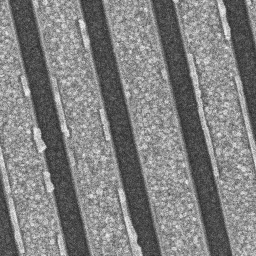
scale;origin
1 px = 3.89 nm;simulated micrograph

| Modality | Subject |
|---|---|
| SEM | one or a few lines or trenches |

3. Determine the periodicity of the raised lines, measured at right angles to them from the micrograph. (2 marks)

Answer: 69.1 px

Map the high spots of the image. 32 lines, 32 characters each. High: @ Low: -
@---@@@@@@---@@@@@@---@@@@@@---@
@---@@@@@@---@@@@@@---@@@@@@---@
@@---@@@@@@--@@@@@@---@@@@@@---@
@@---@@@@@@---@@@@@@---@@@@@@---
@@---@@@@@@---@@@@@@---@@@@@@---
@@---@@@@@@---@@@@@@---@@@@@@---
@@---@@@@@@---@@@@@@---@@@@@@---
@@@---@@@@@@---@@@@@@--@@@@@@---
@@@---@@@@@@---@@@@@@---@@@@@@--
@@@---@@@@@@---@@@@@@---@@@@@@--
@@@---@@@@@@---@@@@@@---@@@@@@--
@@@@---@@@@@@---@@@@@---@@@@@@--
@@@@---@@@@@@---@@@@@@---@@@@@@-
@@@@---@@@@@@---@@@@@@---@@@@@@-
@@@@---@@@@@@---@@@@@@---@@@@@@-
@@@@@---@@@@@@--@@@@@@---@@@@@@-
@@@@@---@@@@@@---@@@@@@---@@@@@@
@@@@@---@@@@@@---@@@@@@---@@@@@@
@@@@@@--@@@@@@---@@@@@@---@@@@@@
@@@@@@--@@@@@@---@@@@@@---@@@@@@
@@@@@@---@@@@@@---@@@@@@--@@@@@@
@@@@@@---@@@@@@---@@@@@@---@@@@@
@@@@@@---@@@@@@---@@@@@@---@@@@@
-@@@@@@--@@@@@@---@@@@@@---@@@@@
-@@@@@@---@@@@@@---@@@@@---@@@@@
-@@@@@@---@@@@@@---@@@@@@---@@@@
-@@@@@@---@@@@@@---@@@@@@---@@@@
-@@@@@@---@@@@@@---@@@@@@---@@@@
--@@@@@@---@@@@@@--@@@@@@---@@@@
--@@@@@@---@@@@@@---@@@@@@---@@@
--@@@@@@---@@@@@@---@@@@@@---@@@
--@@@@@@---@@@@@@@--@@@@@@---@@@